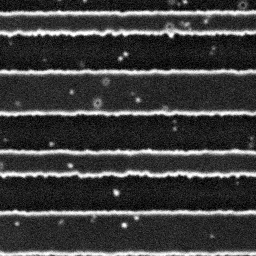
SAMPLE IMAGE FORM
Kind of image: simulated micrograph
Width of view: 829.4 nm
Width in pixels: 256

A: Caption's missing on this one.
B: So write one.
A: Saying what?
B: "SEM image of lines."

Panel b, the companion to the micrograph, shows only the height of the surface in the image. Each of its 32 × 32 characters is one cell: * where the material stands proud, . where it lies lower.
................................
.......*..........**.*..******.*
********************************
********************************
................................
................................
................................
................................
................................
********************************
********************************
********************************
********************************
********************************
................................
................................
................................
................................
................................
********************************
********************************
********************************
................................
................................
................................
................................
***...**************************
********************************
********************************
********************************
********************************
********************************